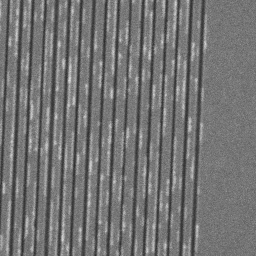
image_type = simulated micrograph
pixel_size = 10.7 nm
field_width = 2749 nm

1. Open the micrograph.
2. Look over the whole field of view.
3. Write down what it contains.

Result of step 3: parallel lines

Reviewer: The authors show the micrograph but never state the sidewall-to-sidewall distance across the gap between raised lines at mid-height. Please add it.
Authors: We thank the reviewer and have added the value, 38.9 nm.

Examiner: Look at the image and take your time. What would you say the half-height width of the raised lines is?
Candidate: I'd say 96.6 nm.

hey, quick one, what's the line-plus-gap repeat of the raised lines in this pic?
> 130 nanometres